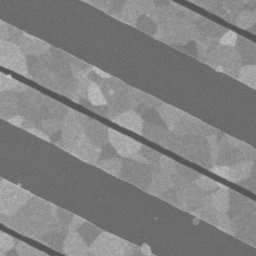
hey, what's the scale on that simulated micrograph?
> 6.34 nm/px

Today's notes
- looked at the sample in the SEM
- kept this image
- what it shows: lines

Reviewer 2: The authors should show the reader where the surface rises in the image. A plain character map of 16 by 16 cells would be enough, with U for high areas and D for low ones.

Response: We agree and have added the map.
DDDDDDUUUUUUUUUU
UDDDDDDDUUUUUUUU
UUUDDDDDDDUUUUUU
UUUUUDDDDDDDUUUU
UUUUUUDDDDDDDDUU
UUUUUUUUDDDDDDDD
UUUUDUUUUUDDDDDD
UUUUUUUUUUUUDDDD
DDUUUUUUUUUUUUDD
DDDDUUUUUUUUUUUU
DDDDDDUUUUUUUUUU
UDDDDDDDUUUUUUUU
UUUDDDDDDDUUUUUU
UUUUUDDDDDDDUUUU
UUUUUUUDDDDDDDUU
UUUUUUUUUDDDDDDD